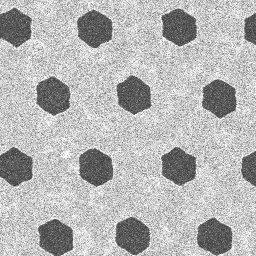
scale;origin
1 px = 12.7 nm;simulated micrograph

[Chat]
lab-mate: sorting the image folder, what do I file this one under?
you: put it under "holes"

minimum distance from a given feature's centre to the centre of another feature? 1000 nm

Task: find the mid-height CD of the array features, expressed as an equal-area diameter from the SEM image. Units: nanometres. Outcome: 457